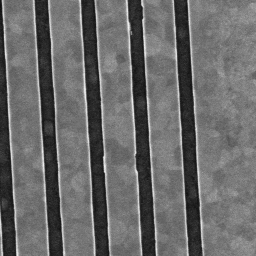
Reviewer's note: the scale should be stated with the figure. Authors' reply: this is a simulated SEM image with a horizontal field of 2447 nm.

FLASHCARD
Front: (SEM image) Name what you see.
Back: parallel lines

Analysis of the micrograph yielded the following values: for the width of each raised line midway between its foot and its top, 0.298 micrometres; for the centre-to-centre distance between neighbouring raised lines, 443 nanometres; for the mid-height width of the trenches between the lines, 0.14 micrometres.